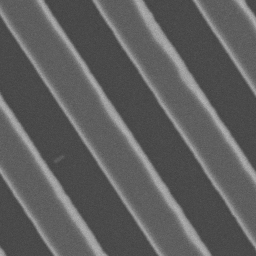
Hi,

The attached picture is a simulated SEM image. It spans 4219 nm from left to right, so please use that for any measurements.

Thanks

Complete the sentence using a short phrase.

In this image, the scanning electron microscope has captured lines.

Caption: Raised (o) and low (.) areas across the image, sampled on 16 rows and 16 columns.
ooo...ooo...ooo.
oooo...ooo...ooo
.ooo...ooo....oo
..ooo...ooo...oo
..oooo...ooo...o
...ooo...ooo....
....ooo...ooo...
o...oooo...ooo..
oo...ooo...ooo..
oo....ooo...ooo.
ooo...oooo...ooo
oooo...ooo...ooo
.ooo....ooo...oo
..ooo...ooo....o
..oooo...ooo...o
...ooo....ooo...